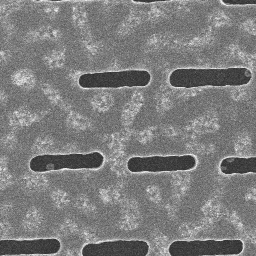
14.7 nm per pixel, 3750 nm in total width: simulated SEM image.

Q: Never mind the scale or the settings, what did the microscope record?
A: holes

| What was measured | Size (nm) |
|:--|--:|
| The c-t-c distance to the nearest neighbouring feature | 1400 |